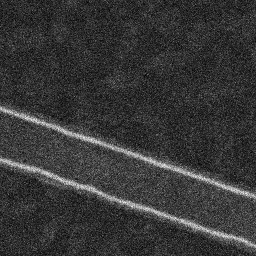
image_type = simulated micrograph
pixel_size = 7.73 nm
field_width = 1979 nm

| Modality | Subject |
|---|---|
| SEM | one or a few lines or trenches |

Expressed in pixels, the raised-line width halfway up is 47.2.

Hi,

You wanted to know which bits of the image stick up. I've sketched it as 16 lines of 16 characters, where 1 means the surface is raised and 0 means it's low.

0000000000000000
0000000000000000
0000000000000000
0000000000000000
0000000000000000
0000000000000000
0000000000000000
1100000000000000
1111100000000000
1111111100000000
0011111111100000
0000011111111100
0000000111111111
0000000000111111
0000000000000111
0000000000000000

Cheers